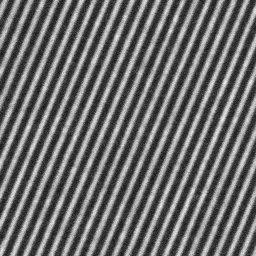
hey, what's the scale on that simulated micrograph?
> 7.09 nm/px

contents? parallel lines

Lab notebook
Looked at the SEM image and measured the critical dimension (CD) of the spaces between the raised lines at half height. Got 59.7 nanometres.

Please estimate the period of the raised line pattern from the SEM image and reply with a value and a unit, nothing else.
11.7 px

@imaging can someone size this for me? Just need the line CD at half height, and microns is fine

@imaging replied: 0.0237